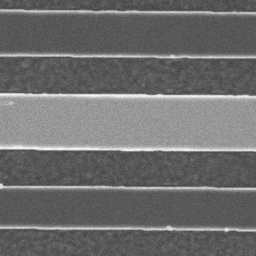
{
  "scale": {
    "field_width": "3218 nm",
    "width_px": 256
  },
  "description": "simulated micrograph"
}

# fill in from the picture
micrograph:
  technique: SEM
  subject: lines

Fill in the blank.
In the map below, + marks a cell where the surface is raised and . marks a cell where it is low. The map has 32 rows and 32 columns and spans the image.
................................
++++++++++++++++++++++++++......
++++++++++++++++++++++++++++++++
++++++++++++++++++++++++++++++++
++++++++++++++++++++++++++++++++
++++++++++++++++++++++++++++++++
++++++++++++++++++++++++++++++++
................................
................................
................................
................................
................................
++++++++++++++++++++++++++++++++
++++++++++++++++++++++++++++++++
++++++++++++++++++++++++++++++++
++++++++++++++++++++++++++++++++
++++++++++++++++++++++++++++++++
++++++++++++++++++++++++++++++++
++++++++++++++++++++++++++++++++
................................
................................
................................
................................
++++++++++++++++++++++++.+......
++++++++++++++++++++++++++++++++
++++++++++++++++++++++++++++++++
++++++++++++++++++++++++++++++++
++++++++++++++++++++++++++++++++
++++++++++++++++++++++++++++++++
................................
................................
................................